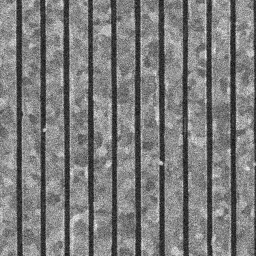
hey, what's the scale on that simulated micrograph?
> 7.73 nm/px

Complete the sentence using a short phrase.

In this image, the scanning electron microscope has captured parallel lines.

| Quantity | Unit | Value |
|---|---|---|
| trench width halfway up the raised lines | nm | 47.3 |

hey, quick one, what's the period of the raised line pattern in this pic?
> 183 nm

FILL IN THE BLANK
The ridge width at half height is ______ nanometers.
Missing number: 134